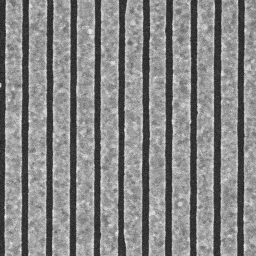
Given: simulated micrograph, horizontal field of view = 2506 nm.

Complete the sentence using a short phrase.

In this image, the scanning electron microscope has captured parallel lines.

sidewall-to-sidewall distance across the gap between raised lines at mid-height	6.87	pixels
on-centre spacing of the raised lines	235	nm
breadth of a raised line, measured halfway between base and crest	0.167	um